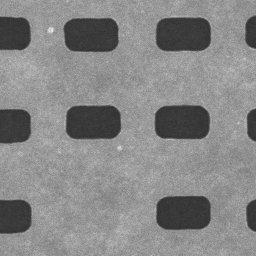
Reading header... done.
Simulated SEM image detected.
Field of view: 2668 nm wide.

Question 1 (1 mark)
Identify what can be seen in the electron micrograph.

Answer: holes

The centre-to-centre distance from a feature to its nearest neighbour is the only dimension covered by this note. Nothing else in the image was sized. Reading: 916 nm